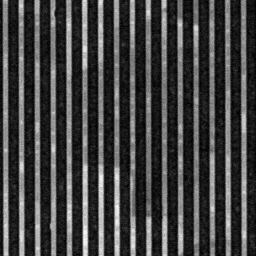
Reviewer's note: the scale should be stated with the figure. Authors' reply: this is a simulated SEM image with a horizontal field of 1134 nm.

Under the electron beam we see parallel lines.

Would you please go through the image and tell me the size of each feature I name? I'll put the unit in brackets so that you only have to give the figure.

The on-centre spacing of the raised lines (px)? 15.9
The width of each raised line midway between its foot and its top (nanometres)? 20.5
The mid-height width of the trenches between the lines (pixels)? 11.2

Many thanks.